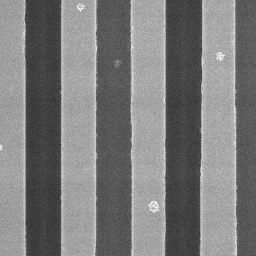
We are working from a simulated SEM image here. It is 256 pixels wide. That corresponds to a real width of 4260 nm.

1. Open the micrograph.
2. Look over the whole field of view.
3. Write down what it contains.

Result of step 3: lines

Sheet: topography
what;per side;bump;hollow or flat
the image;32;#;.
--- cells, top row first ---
###.....####....#####....####...
###.....####....#####....####...
###.....####....#####....####...
###.....####....#####....####...
###.....####....#####....####...
###.....####....#####....####...
###.....####....#####....####...
###.....####.....####....####...
###.....####....#####....####...
###.....####.....####....####...
###.....####.....####....####...
###.....####.....####....####...
###.....####....#####....####...
###.....####....#####....####...
###.....####....#####....####...
###.....####.....####....####...
###.....####.....####....####...
###.....####.....####....####...
###.....####....#####....####...
###.....####....#####....####...
###.....####.....####....####...
###.....####.....####....####...
###.....####.....###.....####...
###.....####.....####....####...
###.....####.....####....####...
###.....####.....###.....####...
###.....####.....####....####...
###.....####.....####....#####..
###.....####.....####....#####..
###.....####.....####....#####..
###.....####.....###.....#####..
###.....####.....###.....#####..